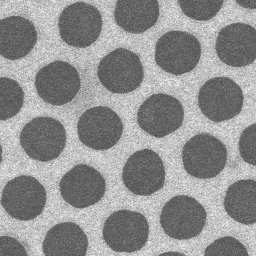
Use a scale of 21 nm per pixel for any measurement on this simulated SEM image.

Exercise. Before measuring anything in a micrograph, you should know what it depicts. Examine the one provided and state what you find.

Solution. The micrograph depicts a regular array of holes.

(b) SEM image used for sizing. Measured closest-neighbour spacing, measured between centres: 1.24 um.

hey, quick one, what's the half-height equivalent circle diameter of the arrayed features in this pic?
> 950 nm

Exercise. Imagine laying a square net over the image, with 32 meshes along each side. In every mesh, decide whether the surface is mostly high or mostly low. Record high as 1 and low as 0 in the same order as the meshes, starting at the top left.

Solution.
11111111100111000000110000001100
11111111000011000000111000011111
00001110000001000000111100111111
00001110000001100001111111110000
00000111000011111111000011100000
00001111000011111111000001100000
00001111111111000110000001100000
11111111111110000010000001110000
11111000011100000011000011111111
11110000001100000011111111111111
00110000001110000011111111000011
00011000001111001111111110000011
00011000011111111100001110000011
00011111111000111000000110000011
00111111110000011000000111000111
11100000110000011000000111111111
11100000110000011100001111111100
11100000110000011111111100011100
11100000111000111111111000001100
11110001111111110000111000001100
11111111111111110000111000001110
11111111000011100000011000001111
10000111000001100000011111111100
00000110000001110000111111111000
00000011000001111111110111110000
00000011100011111111100001110000
10000111111111000111000000110000
11101111111110000011000000111000
11111100001110000001000001111111
01111100000110000001100001111111
00011000000110000011111111000011
00011000000111100111101111000001